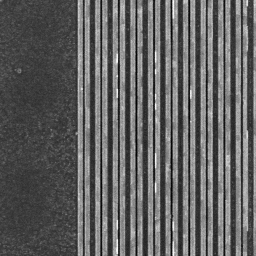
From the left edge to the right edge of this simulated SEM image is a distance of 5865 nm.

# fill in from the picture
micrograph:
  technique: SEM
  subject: parallel lines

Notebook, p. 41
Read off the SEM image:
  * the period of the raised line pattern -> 198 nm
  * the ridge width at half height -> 112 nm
